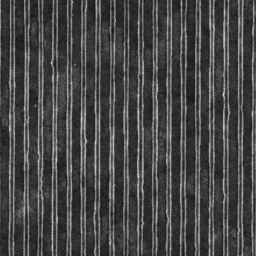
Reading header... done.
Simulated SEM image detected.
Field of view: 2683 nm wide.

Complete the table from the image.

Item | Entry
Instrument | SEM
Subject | parallel lines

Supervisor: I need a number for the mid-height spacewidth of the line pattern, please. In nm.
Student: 104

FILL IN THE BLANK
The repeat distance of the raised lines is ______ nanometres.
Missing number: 150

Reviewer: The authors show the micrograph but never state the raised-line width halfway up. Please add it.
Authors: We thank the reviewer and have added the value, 0.0446 µm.